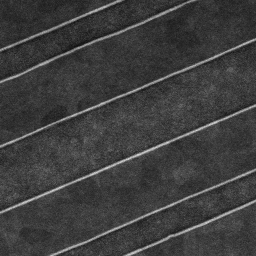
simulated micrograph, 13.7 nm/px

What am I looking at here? one or a few lines or trenches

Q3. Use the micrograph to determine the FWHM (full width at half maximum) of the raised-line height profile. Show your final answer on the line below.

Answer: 59.3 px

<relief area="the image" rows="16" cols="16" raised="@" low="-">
@@@@@@-----@@@@@
@@@@-----@@@@@@@
@@----@@@@@@@@@@
----@@@@@@@@@@--
--@@@@@@@@@-----
@@@@@@@@@-------
@@@@@@----------
@@@@----------@@
@@---------@@@@@
---------@@@@@@@
-------@@@@@@@@@
----@@@@@@@@@@--
--@@@@@@@@@-----
@@@@@@@@@-----@@
@@@@@@@----@@@@@
@@@@-----@@@@@@@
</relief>